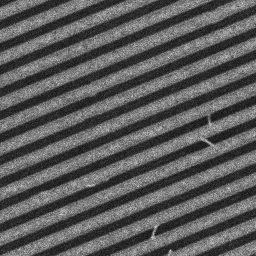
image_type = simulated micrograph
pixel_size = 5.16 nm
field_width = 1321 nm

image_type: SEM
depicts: parallel lines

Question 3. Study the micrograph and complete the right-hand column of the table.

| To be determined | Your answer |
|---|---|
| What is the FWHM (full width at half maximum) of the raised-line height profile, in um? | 0.0649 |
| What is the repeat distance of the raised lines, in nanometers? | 108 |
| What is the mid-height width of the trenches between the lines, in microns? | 0.0447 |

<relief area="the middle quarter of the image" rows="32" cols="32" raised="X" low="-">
---XXXXXXXX------XXXXXXXX-----XX
-XXXXXXXX-----XXXXXXXX------XXXX
XXXXXX------XXXXXXXX------XXXXXX
XXX------XXXXXXXX------XXXXXXXX-
X------XXXXXXXX------XXXXXXX----
----XXXXXXXXX-----XXXXXXXX------
--XXXXXXXX------XXXXXXX------XXX
XXXXXXXX------XXXXXXX------XXXXX
XXXXX------XXXXXXXX-----XXXXXXXX
XXX------XXXXXXX------XXXXXXXX--
------XXXXXXXX------XXXXXXXX----
----XXXXXXX------XXXXXXXX------X
-XXXXXXXX------XXXXXXXX------XXX
XXXXXX------XXXXXXXX------XXXXXX
XXXX------XXXXXXXX------XXXXXXXX
XX------XXXXXXXX-----XXXXXXXX---
-----XXXXXXXX------XXXXXXXX-----
---XXXXXXXX------XXXXXXXX-----XX
XXXXXXXX------XXXXXXXX------XXXX
XXXXXX------XXXXXXXX------XXXXXX
XXX------XXXXXXXX------XXXXXXXX-
X------XXXXXXXX------XXXXXXX----
----XXXXXXXXX-----XXXXXXXX------
--XXXXXXXX------XXXXXXX------XXX
XXXXXXXX-----XXXXXXXX------XXXXX
XXXXX------XXXXXXXX-----XXXXXXXX
XXX------XXXXXXX------XXXXXXXX--
------XXXXXXXX------XXXXXXXX----
----XXXXXXX------XXXXXXXX------X
-XXXXXXXX------XXXXXXXX------XXX
XXXXXXX-----XXXXXXXX------XXXXXX
XXXXX-----XXXXXXXX------XXXXXXXX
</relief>